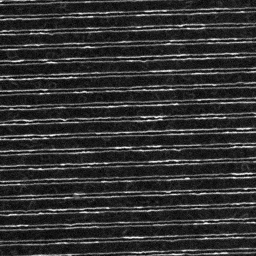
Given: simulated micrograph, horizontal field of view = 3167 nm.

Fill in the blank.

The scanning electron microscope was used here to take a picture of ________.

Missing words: parallel lines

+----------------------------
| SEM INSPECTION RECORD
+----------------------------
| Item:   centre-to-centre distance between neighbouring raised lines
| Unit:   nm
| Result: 186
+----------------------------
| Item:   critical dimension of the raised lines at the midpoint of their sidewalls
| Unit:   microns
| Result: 0.15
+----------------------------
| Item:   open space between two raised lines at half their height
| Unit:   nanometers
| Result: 37.1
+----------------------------